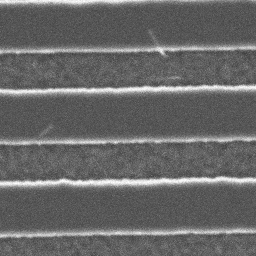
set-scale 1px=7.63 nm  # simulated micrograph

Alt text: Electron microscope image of lines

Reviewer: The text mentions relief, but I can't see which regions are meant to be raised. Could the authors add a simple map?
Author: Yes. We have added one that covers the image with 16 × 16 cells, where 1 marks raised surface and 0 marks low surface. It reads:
1111111111111111
1111111111111111
1111111111111111
0000000000000000
0000000000000000
0000000000011111
1111111111111111
1111111111111111
1111111111111111
0000000000000000
0000000000000000
1111111111111111
1111111111111111
1111111111111111
1111111111111111
0000000000000000